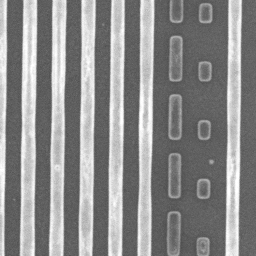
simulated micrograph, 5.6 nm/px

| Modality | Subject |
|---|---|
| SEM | wiring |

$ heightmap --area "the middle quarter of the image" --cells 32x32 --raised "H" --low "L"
LLLLHHHLLLLLHHHLLLLHHHLLLLHHHLLL
LLLLHHHLLLLLHHHLLLLHHHLLLLHHHLLL
LLLLHHHLLLLLHHHLLLLHHHLLLLHHHLLL
LLLLHHHLLLLLHHHLLLLHHHLLLLHHHLLL
LLLLHHHLLLLLHHHLLLLHHHLLLLLLLLLL
LLLLHHHLLLLLHHHLLLLHHHLLLLLLLLLL
LLLLHHHLLLLLHHHLLLLHHHLLLLLLLLLL
LLLLHHHLLLLLHHHLLLLHHHLLLLLLLLLL
LLLLHHHLLLLLHHHLLLLHHHLLLLHHHLLL
LLLLHHHLLLLLHHHLLLLHHHLLLLHHHLLL
LLLLHHHLLLLLHHHLLLLHHHLLLLHHHLLL
LLLLHHHLLLLLHHHLLLLHHHLLLLHHHLLL
LLLLHHHLLLLLHHHLLLLHHHLLLLHHHLLL
LLLLHHHLLLLLHHHLLLLHHHLLLLHHHLLL
LLLLHHHLLLLLHHHLLLLHHHLLLLHHHLLL
LLLLHHHLLLLLHHHLLLLHHHLLLLHHHLLL
LLLLHHHLLLLLHHHLLLLHHHLLLLHHHLLL
LLLLHHHLLLLLHHHLLLLHHHLLLLHHHLLL
LLLLHHHLLLLLHHHLLLLHHHLLLLLHHLLL
LLLLHHHLLLLLHHHLLLLHHHLLLLLLLLLL
LLLLHHHLLLLLHHHLLLLHHHLLLLLLLLLL
LLLLHHHLLLLLHHHLLLLHHHLLLLLLLLLL
LLLLHHHLLLLLHHHLLLLHHHLLLLLHLLLL
LLLLHHHLLLLLHHHLLLLHHHLLLLHHHLLL
LLLLHHHLLLLHHHHLLLLHHHLLLLHHHLLL
LLLLHHHLLLLHHHHLLLLHHHLLLLHHHLLL
LLLLHHHLLLLHHHHLLLLHHLLLLLHHHLLL
LLLLHHHLLLLHHHLLLLLHHLLLLLHHHLLL
LLLLHHHLLLLHHHLLLLLHHLLLLLHHHLLL
LLLLHHHLLLLHHHLLLLLHHLLLLLHHHLLL
LLLLHHHLLLLHHHLLLLLHHLLLLLHHHLLL
LLLLHHHLLLLHHHLLLLLHHLLLLLHHHLLL